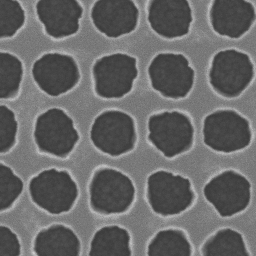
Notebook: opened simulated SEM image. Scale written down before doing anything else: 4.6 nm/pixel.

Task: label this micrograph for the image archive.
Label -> a regular array of holes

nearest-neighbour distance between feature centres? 265 nm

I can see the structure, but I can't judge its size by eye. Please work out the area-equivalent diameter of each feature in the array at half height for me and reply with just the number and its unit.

205 nm